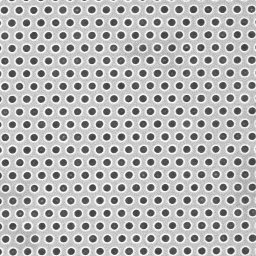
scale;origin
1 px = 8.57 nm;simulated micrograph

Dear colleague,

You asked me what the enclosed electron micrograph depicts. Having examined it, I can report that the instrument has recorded a regular array of holes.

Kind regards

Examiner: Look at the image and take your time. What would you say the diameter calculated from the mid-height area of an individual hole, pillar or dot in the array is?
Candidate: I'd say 64.9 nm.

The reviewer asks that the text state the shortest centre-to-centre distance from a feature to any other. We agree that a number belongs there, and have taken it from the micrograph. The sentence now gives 122 nm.